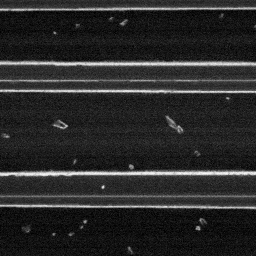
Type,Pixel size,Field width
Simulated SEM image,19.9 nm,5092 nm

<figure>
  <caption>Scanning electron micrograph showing lines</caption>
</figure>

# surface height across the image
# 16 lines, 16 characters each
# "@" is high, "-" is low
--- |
@@@@@@@@@@------
----------------
----------------
----------------
@@@@@@@@@@@@@@@@
@@@@@@@@@@@@@@@@
----------------
----------------
----------------
----------------
----------------
@@@@@@@@@@@@@@@@
@@@@@@@@@@@@@@@@
----------------
----------------
----------------